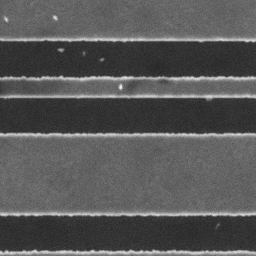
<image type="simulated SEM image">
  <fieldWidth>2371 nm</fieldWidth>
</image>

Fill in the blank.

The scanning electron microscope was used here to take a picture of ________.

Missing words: lines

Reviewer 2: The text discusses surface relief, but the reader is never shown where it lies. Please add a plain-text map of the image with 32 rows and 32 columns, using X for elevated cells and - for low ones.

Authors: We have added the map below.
XXXXXXXXXXXXXXXXXXXXXXXXXXXXXXXX
XXXXXXXXXXXXXXXXXXXXXXXXXXXXXXXX
XXXXXXXXXXXXXXXXXXXXXXXXXXXXXXXX
XXXXXXXXXXXXXXXXXXXXXXXXXXXXXXXX
XXXXXXXXXXXXXXXXXXXXXXXXXXXXXXXX
--------------------------------
--------------------------------
--------------------------------
--------------------------------
--------------------------------
XXXXXXXXXXXXXXXXXXXXXXXXXXXXXXXX
XXXXXXXXXXXXXXXXXXXXXXXXXXXXXXXX
--------------------------------
--------------------------------
--------------------------------
--------------------------------
--------------------------------
XXXXXXXXXXXXXXXXXXXXXXXXXXXXXXXX
XXXXXXXXXXXXXXXXXXXXXXXXXXXXXXXX
XXXXXXXXXXXXXXXXXXXXXXXXXXXXXXXX
XXXXXXXXXXXXXXXXXXXXXXXXXXXXXXXX
XXXXXXXXXXXXXXXXXXXXXXXXXXXXXXXX
XXXXXXXXXXXXXXXXXXXXXXXXXXXXXXXX
XXXXXXXXXXXXXXXXXXXXXXXXXXXXXXXX
XXXXXXXXXXXXXXXXXXXXXXXXXXXXXXXX
XXXXXXXXXXXXXXXXXXXXXXXXXXXXXXXX
XXXXXXXXXXXXXXXXXXXXXXXXXXXXXXXX
--------------------------------
--------------------------------
--------------------------------
--------------------------------
X-XXXXXXXX-XXXXXXXXXXXXX-XX-XXX-